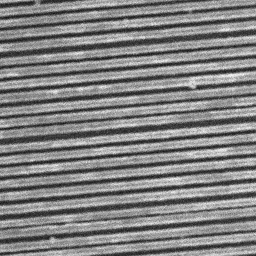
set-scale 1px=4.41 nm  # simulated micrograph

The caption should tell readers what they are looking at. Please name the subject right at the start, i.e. parallel lines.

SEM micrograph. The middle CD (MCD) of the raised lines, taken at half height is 26.9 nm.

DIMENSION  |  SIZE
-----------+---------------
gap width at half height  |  26.4 nm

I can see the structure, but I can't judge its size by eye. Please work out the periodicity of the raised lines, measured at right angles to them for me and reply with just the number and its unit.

54.6 nm